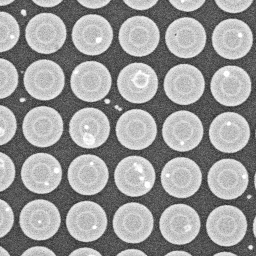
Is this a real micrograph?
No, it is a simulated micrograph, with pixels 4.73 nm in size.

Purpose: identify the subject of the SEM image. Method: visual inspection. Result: an array of small figures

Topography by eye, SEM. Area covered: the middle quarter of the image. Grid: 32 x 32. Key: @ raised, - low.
---@@@@@@@------@@@@@-------@@@@
---@@@@@@@@----@@@@@@@-----@@@@@
--@@@@@@@@@---@@@@@@@@@---@@@@@@
--@@@@@@@@@@-@@@@@@@@@@--@@@@@@@
--@@@@@@@@@@-@@@@@@@@@@--@@@@@@@
--@@@@@@@@@@-@@@@@@@@@@--@@@@@@@
--@@@@@@@@@---@@@@@@@@@--@@@@@@@
---@@@@@@@@---@@@@@@@@@---@@@@@@
----@@@@@@-----@@@@@@@----@@@@@@
----------@------@@@--------@@@@
--------------------------------
----@@@@@--------@@-------------
---@@@@@@@-----@@@@@@------@@@@@
--@@@@@@@@@---@@@@@@@@----@@@@@@
--@@@@@@@@@--@@@@@@@@@@--@@@@@@@
-@@@@@@@@@@--@@@@@@@@@@--@@@@@@@
-@@@@@@@@@@--@@@@@@@@@@--@@@@@@@
--@@@@@@@@@--@@@@@@@@@@--@@@@@@@
--@@@@@@@@@--@@@@@@@@@@--@@@@@@@
---@@@@@@@----@@@@@@@@---@@@@@@@
----@@@@@------@@@@@@-----@@@@@@
----------------------------@@@-
--------------------------------
---@@@@@@------@@@@@--------@@--
--@@@@@@@@----@@@@@@@-----@@@@@@
-@@@@@@@@@---@@@@@@@@@---@@@@@@@
-@@@@@@@@@@--@@@@@@@@@---@@@@@@@
-@@@@@@@@@@--@@@@@@@@@@-@@@@@@@@
-@@@@@@@@@@--@@@@@@@@@@-@@@@@@@@
-@@@@@@@@@@--@@@@@@@@@@-@@@@@@@@
--@@@@@@@@---@@@@@@@@@---@@@@@@@
---@@@@@@-----@@@@@@@----@@@@@@@